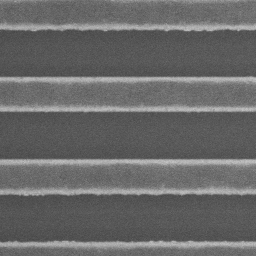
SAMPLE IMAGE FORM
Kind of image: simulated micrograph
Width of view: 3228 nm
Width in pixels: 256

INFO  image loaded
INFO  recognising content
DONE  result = lines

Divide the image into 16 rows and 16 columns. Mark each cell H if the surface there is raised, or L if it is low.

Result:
HHHHHHHHHHHHHHHH
HHHHHHHHHHHHHHHH
LLLLLLLLLLLLLLLL
LLLLLLLLLLLLLLLL
LLLLLLLLLLLLLLLL
HHHHHHHHHHHHHHHH
HHHHHHHHHHHHHHHH
LLLLLLLLLLLLLLLL
LLLLLLLLLLLLLLLL
LLLLLLLLLLLLLLLL
HHHHHHHHHHHHHHHH
HHHHHHHHHHHHHHHH
LLLLLLLLLLLLLLLL
LLLLLLLLLLLLLLLL
LLLLLLLLLLLLLLLL
HHHHHHHHHHHHHHHH